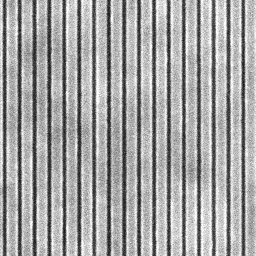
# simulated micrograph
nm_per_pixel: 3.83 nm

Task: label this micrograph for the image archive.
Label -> parallel lines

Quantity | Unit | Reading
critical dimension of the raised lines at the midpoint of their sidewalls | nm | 37.8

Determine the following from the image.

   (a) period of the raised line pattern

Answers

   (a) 57.2 nm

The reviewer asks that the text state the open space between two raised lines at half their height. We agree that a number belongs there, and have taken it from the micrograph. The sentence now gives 0.0172 µm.